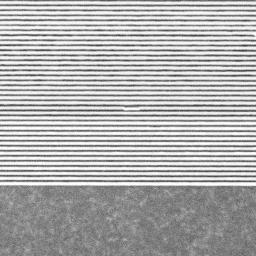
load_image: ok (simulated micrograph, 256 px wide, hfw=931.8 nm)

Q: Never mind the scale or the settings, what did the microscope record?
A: parallel lines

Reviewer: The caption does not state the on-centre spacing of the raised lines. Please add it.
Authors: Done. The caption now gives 18.3 nanometres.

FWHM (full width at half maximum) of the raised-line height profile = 2.5 pixels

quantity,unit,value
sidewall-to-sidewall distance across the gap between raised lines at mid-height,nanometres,9.1